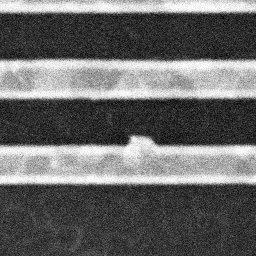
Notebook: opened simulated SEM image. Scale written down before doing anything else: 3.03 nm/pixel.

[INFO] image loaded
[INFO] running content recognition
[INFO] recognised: one or a few lines or trenches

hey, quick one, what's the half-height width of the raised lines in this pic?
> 90.9 nm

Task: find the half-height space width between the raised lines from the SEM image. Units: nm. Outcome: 169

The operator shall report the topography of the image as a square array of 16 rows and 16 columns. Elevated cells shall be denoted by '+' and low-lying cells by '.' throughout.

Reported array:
................
................
................
................
++++++++++++++++
++++++++++++++++
................
................
................
++++++++++++++++
++++++++++++++++
................
................
................
................
................